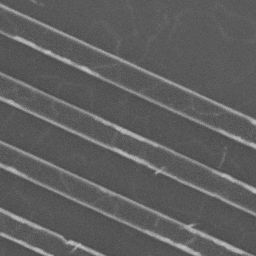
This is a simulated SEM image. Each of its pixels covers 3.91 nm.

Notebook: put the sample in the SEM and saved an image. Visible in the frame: parallel lines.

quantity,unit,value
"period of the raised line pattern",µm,0.24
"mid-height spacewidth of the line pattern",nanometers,149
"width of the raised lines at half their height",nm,92.1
